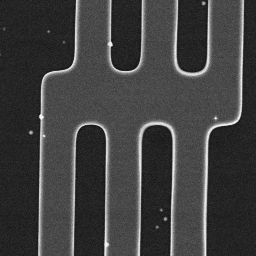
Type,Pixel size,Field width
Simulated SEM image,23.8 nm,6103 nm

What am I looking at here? groups of lines, slits or small figures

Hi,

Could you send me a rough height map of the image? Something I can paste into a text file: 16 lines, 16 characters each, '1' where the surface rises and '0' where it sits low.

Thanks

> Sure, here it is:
0000011001100110
0000011001100110
0000011001100110
0000011001100110
0001111111111110
0001111111111110
0001111111111110
0001111111111110
0001100110011000
0001100110011000
0011100110011000
0011100110011000
0011100110011000
0011100110011000
0011100110011000
0011100110011000